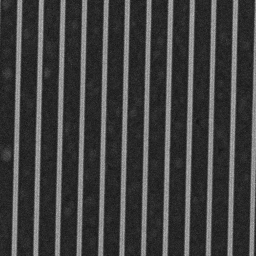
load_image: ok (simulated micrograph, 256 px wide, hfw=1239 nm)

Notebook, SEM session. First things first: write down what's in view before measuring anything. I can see parallel lines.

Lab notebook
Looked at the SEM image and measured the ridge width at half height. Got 19.4 nm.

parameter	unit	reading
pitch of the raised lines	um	0.104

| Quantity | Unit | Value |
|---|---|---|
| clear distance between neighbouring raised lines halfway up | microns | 0.0865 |